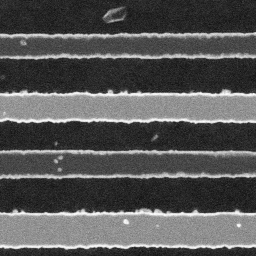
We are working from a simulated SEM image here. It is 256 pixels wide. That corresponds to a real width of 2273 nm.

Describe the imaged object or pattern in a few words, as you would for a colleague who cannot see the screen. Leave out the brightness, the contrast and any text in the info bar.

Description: lines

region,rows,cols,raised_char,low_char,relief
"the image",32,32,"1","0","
00000000000000000000000000000000
00000000000000000000000000000000
00000000000000000000000000000000
00000000000000000000000000000000
11111111111111111111111111111111
11111111111111111111111111111111
11111111111111111111111111111111
00000000000000000000000000000000
00000000000000000000000000000000
00000000000000000000000000000000
00000000000000000000000000000000
00000000000000000000000000000000
11111111111111111111111111111111
11111111111111111111111111111111
11111111111111111111111111111111
00000000000000000000000000000000
00000000000000000000000000000000
00000000000000000000000000000000
00000000000000000000000000000000
11111111111111111111111111111111
11111111111111111111111111111111
11111111111111111111111111111111
00000000000000000000000000000000
00000000000000000000000000000000
00000000000000000000000000000000
00000000000000000000000000000000
00000000000000000000000000000000
11111111111111111111111111111111
11111111111111111111111111111111
11111111111111111111111111111111
11111111111111111111111111111111
00000000000000000000000000000000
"